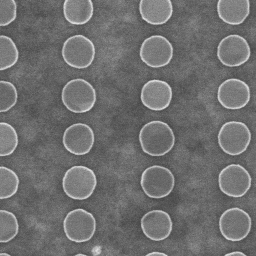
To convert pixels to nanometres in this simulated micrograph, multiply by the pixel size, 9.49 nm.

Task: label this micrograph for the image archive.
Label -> a regular array of raised bodies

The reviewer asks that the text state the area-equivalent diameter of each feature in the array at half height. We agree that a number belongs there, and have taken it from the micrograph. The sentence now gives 303 nm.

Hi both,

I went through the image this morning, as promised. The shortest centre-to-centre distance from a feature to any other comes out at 409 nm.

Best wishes